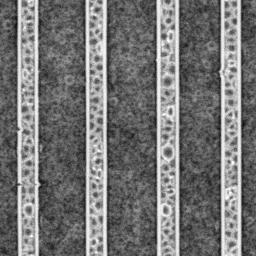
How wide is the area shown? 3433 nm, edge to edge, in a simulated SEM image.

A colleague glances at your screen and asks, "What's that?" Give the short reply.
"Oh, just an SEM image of one or a few lines or trenches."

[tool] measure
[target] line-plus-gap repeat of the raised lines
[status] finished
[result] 908 nanometers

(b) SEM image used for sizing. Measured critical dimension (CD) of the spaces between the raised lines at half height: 687 nm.